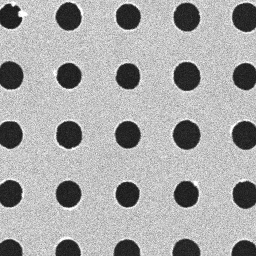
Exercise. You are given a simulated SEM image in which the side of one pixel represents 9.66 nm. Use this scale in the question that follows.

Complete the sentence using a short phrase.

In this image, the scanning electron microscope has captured a regular array of holes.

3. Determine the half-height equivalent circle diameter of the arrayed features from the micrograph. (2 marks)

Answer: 259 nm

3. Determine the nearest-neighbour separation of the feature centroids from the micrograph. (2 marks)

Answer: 567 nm